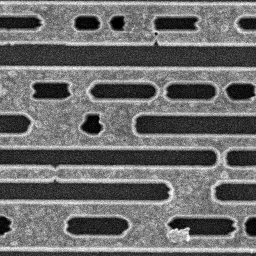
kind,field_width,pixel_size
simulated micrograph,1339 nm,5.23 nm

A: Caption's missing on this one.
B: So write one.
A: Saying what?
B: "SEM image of parallel lines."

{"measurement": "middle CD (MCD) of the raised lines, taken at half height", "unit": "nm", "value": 73.9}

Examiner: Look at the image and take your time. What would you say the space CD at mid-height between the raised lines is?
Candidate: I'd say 103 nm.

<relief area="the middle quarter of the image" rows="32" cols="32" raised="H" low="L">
LLLLLLLLLLLLLLLLLLLLLLLLLLLLLLLL
HHHHHHHHHHHHHHHHHHHHHHHHHHHHHHHH
HHHHHHHHHHHHHHHHHHHHHHHHHHHHHHHH
HHHHHHHHHHHHHHHHHHHHHHHHHHHHHHHH
HHHHHHHHLLLLLLLLLLLHHHHHHHHLLLHH
LHHHHHHLLLLLLLLLLLLLLLLHHHLLLLLL
LHHHHHLLLLLLLLLLLLLLLLLHHLLLLLLL
LLHHHHHLLLLLLLLLLLLLLLLHHLLLLLLL
LHHHHHHLLLLLLLLLLLLLLLHHHHLLLLLL
HHHHHHHHHHHHHHHHHHHHHHHHHHHHHHHH
HHHHHHHHHHHHHHHHHHHHHHHHHHHHHHHH
HHHHHHHHHHHHHHHHHHHHHHHHHHHHHHHH
HHHHHHLLLHHHHHHHHHHLLLLLLLLLLLHH
HHHHHLLLLHHHHHHHHHLLLLLLLLLLLLLL
HHHHHLLLLHHHHHHHHHLLLLLLLLLLLLLL
HHHHLLLLLLHHHHHHHHLLLLLLLLLLLLLL
HHHHLLLLLHHHHHHHHHLLLLLLLLLLLLLL
HHHHHHLLLHHHHHHHHHLLLLLLLLLLLLLL
HHHHHHHHHHHHHHHHHHHHHHHHHHHHHHHH
HHHHHHHHHHHHHHHHHHHHHHHHHHHHHHHH
HHHHHHHHHHHHHHHHHHHHHHHHHHHHHHHH
LLLLLLLLLLLLLLLLLLLLLLLLLLLLLLLL
LLLLLLLLLLLLLLLLLLLLLLLLLLLLLLLL
LLLLLLLLLLLLLLLLLLLLLLLLLLLLLLLL
LLLLLLLLLLLLLLLLLLLLLLLLLLLLLLLL
LLLLLLLLLLLLLLLLLLLLLLLLLLLLLLLL
HHHHHHHHHHHHHHHHHHHHHHHHHHHHHHHH
HHHHHHHHHHHHHHHHHHHHHHHHHHHHHHHH
HHHHHHHHHHHHHHHHHHHHHHHHHHHHHHHH
LLLLLLLLLLLLLLLLLLLLLLLLLHHHHHHH
LLLLLLLLLLLLLLLLLLLLLLLLLLHHHHHH
LLLLLLLLLLLLLLLLLLLLLLLLLLLHHHHH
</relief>